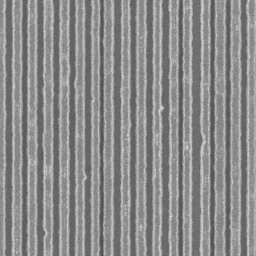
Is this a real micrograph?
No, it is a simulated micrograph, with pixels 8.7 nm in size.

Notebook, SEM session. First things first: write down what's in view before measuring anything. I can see parallel lines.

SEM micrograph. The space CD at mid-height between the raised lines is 64.2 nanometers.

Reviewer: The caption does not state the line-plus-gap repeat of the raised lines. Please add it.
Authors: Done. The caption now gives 15.6 px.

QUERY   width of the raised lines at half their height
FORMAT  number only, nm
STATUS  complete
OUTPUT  74